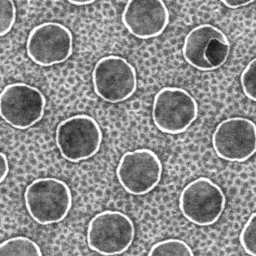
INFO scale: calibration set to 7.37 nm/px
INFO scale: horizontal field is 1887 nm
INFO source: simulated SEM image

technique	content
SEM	a regular array of raised bodies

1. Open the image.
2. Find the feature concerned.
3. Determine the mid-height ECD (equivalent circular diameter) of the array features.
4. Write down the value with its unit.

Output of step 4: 323 nm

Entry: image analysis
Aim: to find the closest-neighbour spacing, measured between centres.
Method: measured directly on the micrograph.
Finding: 507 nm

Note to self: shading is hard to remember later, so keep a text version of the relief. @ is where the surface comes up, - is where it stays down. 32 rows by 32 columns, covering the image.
@@--------------@@@@--------@@@-
@@--------------@@@@@-----------
@@--------------@@@@@-----------
@----@@@--------@@@@-----@@-----
----@@@@@--------@@----@@@@@----
----@@@@@--------------@@@------
----@@@@@--------------@@@------
----@@@@-----@@--------@@@------
------------@@@@@--------@-----@
------------@@@@@-------------@@
------------@@@@@-------------@@
@@@@@-------@@@@@---@@@--------@
@@@@@--------@@----@@@@@--------
@@@@@--------------@@@@@@-------
@@@@@--------------@@@@@--------
-@@@----@@@@--------@@@@----@@@@
-------@@@@@---------@-----@@@@@
-------@@@@@@--------------@@@@@
-------@@@@@---------------@@@@@
--------@@@-----@@@---------@@@-
@--------------@@@@@------------
@--------------@@@@@------------
-----@@--------@@@@@-----@------
---@@@@@--------@@@----@@@@-----
---@@@@@@--------------@@@@@----
---@@@@@@--------------@@@@@----
----@@@@---------------@@@@@----
-----@@-----@@@@--------@@@----@
-----------@@@@@@--------------@
-----------@@@@@@-------------@@
@@@@-------@@@@@----@@@-------@@
@@@@@-------@@@----@@@@@-------@